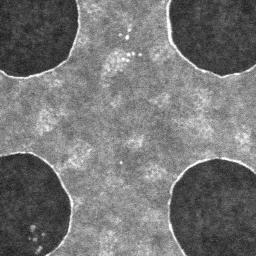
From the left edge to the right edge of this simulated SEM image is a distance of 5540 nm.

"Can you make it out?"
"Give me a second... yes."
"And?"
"holes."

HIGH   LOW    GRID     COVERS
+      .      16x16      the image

.....++++++.....
.....++++++.....
.....++++++.....
....+++++++.....
...++++++++++..+
++++++++++++++++
++++++++++++++++
++++++++++++++++
++++++++++++++++
++++++++++++++++
...+++++++++....
....+++++++.....
....+++++++.....
....+++++++.....
....+++++++.....
...++++++++.....